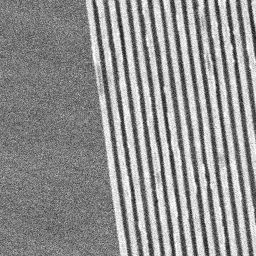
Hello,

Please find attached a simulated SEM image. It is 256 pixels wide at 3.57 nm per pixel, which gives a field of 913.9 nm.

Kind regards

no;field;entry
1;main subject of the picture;parallel lines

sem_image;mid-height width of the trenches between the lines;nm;19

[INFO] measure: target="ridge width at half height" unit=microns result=0.019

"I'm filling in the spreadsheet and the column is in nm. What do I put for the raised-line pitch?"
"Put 39.1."